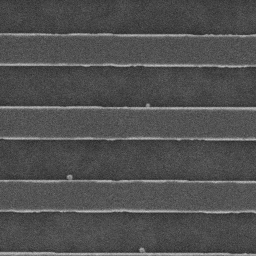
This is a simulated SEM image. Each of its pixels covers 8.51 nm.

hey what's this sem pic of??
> lines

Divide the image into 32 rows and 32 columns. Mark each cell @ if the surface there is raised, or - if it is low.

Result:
--------------------------------
--------------------------------
--------------------------------
--------------------------------
@@@@@@@@@@@@@@@@@@@@@@@@@@@@@@@@
@@@@@@@@@@@@@@@@@@@@@@@@@@@@@@@@
@@@@@@@@@@@@@@@@@@@@@@@@@@@@@@@@
@@@@@@@@@@@@@@@@@@@@@@@@@@@@@@@@
--------------------------------
--------------------------------
--------------------------------
--------------------------------
--------------------------------
@@@@@@@@@@@@@@@@@@@@@@@@@@@@@@@@
@@@@@@@@@@@@@@@@@@@@@@@@@@@@@@@@
@@@@@@@@@@@@@@@@@@@@@@@@@@@@@@@@
@@@@@@@@@@@@@@@@@@@@@@@@@@@@@@@@
--------------------------------
--------------------------------
--------------------------------
--------------------------------
--------------------------------
--------------------------------
@@@@@@@@@@@@@@@@@@@@@@@@@@@@@@@@
@@@@@@@@@@@@@@@@@@@@@@@@@@@@@@@@
@@@@@@@@@@@@@@@@@@@@@@@@@@@@@@@@
-------------------------@@@@@-@
--------------------------------
--------------------------------
--------------------------------
--------------------------------
--------------------------------